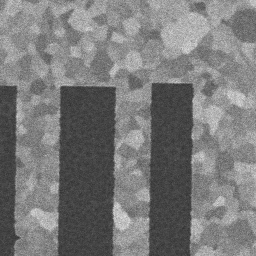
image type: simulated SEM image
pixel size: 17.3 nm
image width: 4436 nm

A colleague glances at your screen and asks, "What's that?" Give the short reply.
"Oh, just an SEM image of one or a few lines or trenches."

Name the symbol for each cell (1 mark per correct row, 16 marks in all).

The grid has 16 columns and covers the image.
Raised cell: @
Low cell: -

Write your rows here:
@@@@@@@@@@@@@@@@
@@@@@@@@@@@@@@@@
@@@@@@@@@@@@@@@@
@@@@@@@@@@@@@@@@
@@@@@@@@@@@@@@@@
-@@@---@@@--@@@@
@@@@---@@---@@@@
-@@@---@@---@@@@
-@@@---@@---@@@@
-@@@---@@---@@@@
-@@@---@@---@@@@
-@@@---@@---@@@@
-@@@---@@---@@@@
-@@@---@@---@@@@
-@@@---@@---@@@@
-@@@---@@---@@@@